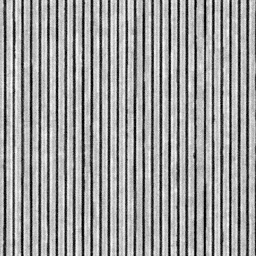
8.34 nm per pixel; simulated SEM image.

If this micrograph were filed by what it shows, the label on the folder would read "parallel lines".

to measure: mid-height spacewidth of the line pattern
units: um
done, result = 0.0333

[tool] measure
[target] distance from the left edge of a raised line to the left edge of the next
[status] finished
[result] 72.3 nm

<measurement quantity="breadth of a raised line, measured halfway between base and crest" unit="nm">41.7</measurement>